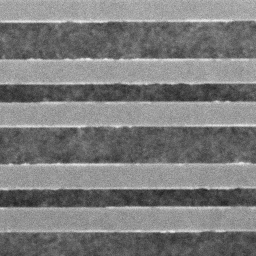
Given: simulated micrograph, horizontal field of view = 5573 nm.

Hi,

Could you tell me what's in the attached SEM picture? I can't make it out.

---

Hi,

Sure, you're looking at lines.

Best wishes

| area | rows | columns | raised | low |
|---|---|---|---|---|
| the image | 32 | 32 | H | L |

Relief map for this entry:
HHHHHHHHHHHHHHHHHHHHHHHHHHHHHHHH
HHHHHHHHHHHHHHHHHHHHHHHHHHHHHHHH
HHHHHHHHHHHHHHHHHHHHHHHHHHHHHHLL
LLLLLLLLLLLLLLLLLLLLLLLLLLLLLLLL
LLLLLLLLLLLLLLLLLLLLLLLLLLLLLLLL
LLLLLLLLLLLLLLLLLLLLLLLLLLLLLLLL
LLLLLLLLLLLLLLLLLLLLLLLLLLLLLLLL
LLLHHLLLHHHHHHLHHHHHHHHHHHHHHHHH
HHHHHHHHHHHHHHHHHHHHHHHHHHHHHHHH
HHHHHHHHHHHHHHHHHHHHHHHHHHHHHHHH
LLLLLLLLLLLLLLLLLLLLLLLLLLLLLLLL
LLLLLLLLLLLLLLLLLLLLLLLLLLLLLLLL
LLLLLLLLLLLLLLLLLLLLLLLLLLLLLLLL
HHHHHHHHHHHHHHHHHHHHHHHHHHHHHHHH
HHHHHHHHHHHHHHHHHHHHHHHHHHHHHHHH
HHHHHHHHHHHHHHHHHHHHHHHHHHHHHHHH
LLLLLLLLLLLLLLLLLLLLLLLLLLLLLLLL
LLLLLLLLLLLLLLLLLLLLLLLLLLLLLLLL
LLLLLLLLLLLLLLLLLLLLLLLLLLLLLLLL
LLLLLLLLLLLLLLLLLLLLLLLLLLLLLLLL
LLLLLLLLLLLLLLLLLLLLLLLLLLLLLHHL
HHHHHHHHHHHHHHHHHHHHHHHHHHHHHHHH
HHHHHHHHHHHHHHHHHHHHHHHHHHHHHHHH
HHHHHHHHHHHHHHHHHHHHHHHHHHHHHHLL
LLLLLLLLLLLLLLLLLLLLLLLLLLLLLLLL
LLLLLLLLLLLLLLLLLLLLLLLLLLLLLLLL
HHHHHHHHHHHHHHHHHHHHHHHHHHHHHHHH
HHHHHHHHHHHHHHHHHHHHHHHHHHHHHHHH
HHHHHHHHHHHHHHHHHHHHHHHHHHHHHHHH
LLLLLLLLLLLLLLLLLLLLLLLLLLLLLLLL
LLLLLLLLLLLLLLLLLLLLLLLLLLLLLLLL
LLLLLLLLLLLLLLLLLLLLLLLLLLLLLLLL